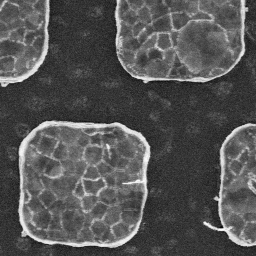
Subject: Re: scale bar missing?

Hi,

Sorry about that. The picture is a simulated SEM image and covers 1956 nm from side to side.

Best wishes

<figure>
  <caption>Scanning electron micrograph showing raised bodies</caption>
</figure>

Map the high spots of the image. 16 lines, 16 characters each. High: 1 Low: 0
1110000111111110
1110000111111110
1110000111111110
1110000111111110
1100000011111100
0000000000000000
0000000000000000
0000000000000000
0011111110000011
0111111110000011
0111111110000011
0111111110000011
0111111110000011
0111111110000011
0011111100000011
0000000000000000